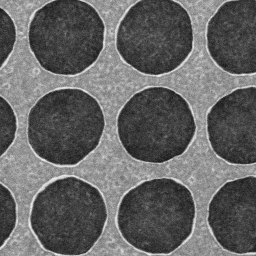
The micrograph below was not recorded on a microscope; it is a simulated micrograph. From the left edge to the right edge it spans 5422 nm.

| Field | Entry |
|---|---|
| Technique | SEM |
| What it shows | holes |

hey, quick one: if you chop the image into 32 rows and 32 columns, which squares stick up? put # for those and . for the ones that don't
######.....######.....######....
.####.......####.......####.....
..##.........##.........##......
..##.........##.........##......
..##.........##.........##......
..##.........##.........##......
.###.........##.........##......
.####.......###........####.....
#####......######.....######....
################################
################################
######.....######.....#######...
.####.......####.......####.....
..##.........##.........##......
..##.........##.........##......
..#..........##.........##......
..#..........##.........##......
..##.........##.........##......
.###........####.......####.....
#####......#####......#####.....
#######..####################...
################################
#######...#########...#######...
.####.......#####......#####....
..##.........##.........###.....
..##.........##.........##......
..##.........##..........#......
..##.........##.........##......
..##.........##.........##......
.####........##.........###.....
#####.......####.......####.....
######.....#######...########...